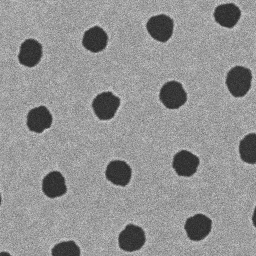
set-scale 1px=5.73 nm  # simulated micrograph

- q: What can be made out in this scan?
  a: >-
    a regular array of holes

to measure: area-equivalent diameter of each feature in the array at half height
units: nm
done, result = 149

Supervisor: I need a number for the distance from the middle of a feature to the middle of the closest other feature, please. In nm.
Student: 382